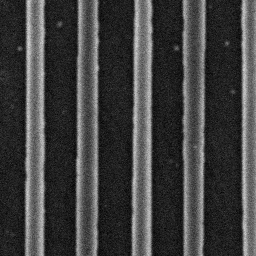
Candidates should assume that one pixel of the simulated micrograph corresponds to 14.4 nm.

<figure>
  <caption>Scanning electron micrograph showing lines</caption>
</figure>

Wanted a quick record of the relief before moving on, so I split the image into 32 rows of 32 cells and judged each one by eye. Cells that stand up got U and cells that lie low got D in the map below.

DDDUUDDDDDUUDDDDDUUDDDDUUUDDDDUU
DDDUUDDDDDUUDDDDDUUDDDDUUUDDDDUU
DDDUUDDDDDUUDDDDDUUDDDDUUUDDDDUU
DDDUUDDDDDUUDDDDDUUDDDDUUUDDDDUU
DDDUUDDDDDUUDDDDDUUDDDDUUUDDDDUU
DDDUUDDDDDUUDDDDDUUDDDDUUDDDDDUU
DDDUUDDDDDUUDDDDDUUDDDDUUDDDDDUU
DDDUUDDDDDUUDDDDDUUDDDDUUDDDDDUU
DDDUUDDDDDUUDDDDDUUDDDDUUDDDDDUU
DDDUUDDDDDUUDDDDDUUDDDDUUDDDDDUU
DDDUUDDDDDUUDDDDDUUDDDDUUDDDDDUU
DDDUUDDDDDUUDDDDDUUDDDDUUDDDDDUU
DDDUUDDDDDUUDDDDDUUDDDDUUDDDDDUU
DDDUUDDDDDUUDDDDDUUDDDDUUDDDDDUU
DDDUUDDDDDUUDDDDDUUDDDDUUDDDDDUU
DDDUUDDDDDUUDDDDDUUDDDDUUDDDDDUU
DDDUUDDDDDUUDDDDDUUDDDDUUDDDDDUU
DDDUUDDDDDUUDDDDDUUDDDDUUDDDDDUU
DDDUUDDDDDUUDDDDDUUDDDDUUDDDDDUU
DDDUUDDDDDUUDDDDDUUDDDDUUDDDDDUU
DDDUUDDDDDUUDDDDDUUDDDDUUDDDDDUU
DDDUUDDDDDUUDDDDDUUDDDDUUDDDDDUU
DDDUUDDDDDUUDDDDDUUDDDDUUDDDDDUU
DDDUUDDDDDUUDDDDDUUDDDDUUDDDDDUU
DDDUUDDDDDUUDDDDDUUDDDDUUDDDDDUU
DDDUUDDDDDUUDDDDDUUDDDDUUDDDDDUU
DDDUUDDDDDUUDDDDDUUDDDDUUDDDDDUU
DDDUUDDDDDUUDDDDDUUDDDDUUDDDDDUU
DDDUUDDDDDUUDDDDDUUDDDDUUDDDDDUU
DDDUUDDDDDUUDDDDDUUDDDDUUDDDDDUU
DDDUUDDDDDUUDDDDDUUDDDDUUDDDDDUU
DDDUUDDDDDUUDDDDDUUDDDDUUDDDDDUU